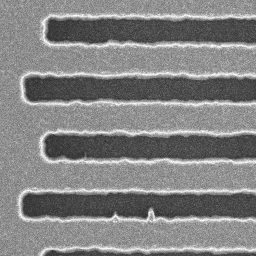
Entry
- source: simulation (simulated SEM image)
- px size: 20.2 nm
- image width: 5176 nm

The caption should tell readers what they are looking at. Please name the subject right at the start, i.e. parallel lines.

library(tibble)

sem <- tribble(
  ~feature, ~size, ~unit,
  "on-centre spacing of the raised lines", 1.18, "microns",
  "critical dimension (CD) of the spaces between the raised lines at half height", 25.9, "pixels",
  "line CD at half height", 655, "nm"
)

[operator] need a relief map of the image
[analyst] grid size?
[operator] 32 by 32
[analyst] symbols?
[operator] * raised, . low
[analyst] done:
********************************
********************************
******..........................
******..........................
******..........................
***********..*****..*******.***.
********************************
********************************
********************************
****.*.**..****...*....*****.***
***.............................
***.............................
***.............................
********************************
********************************
********************************
********************************
*****...........................
*****...........................
******..........................
********************************
********************************
********************************
********************************
***.............................
***.............................
***.............................
********************************
********************************
********************************
********************************
******.........*..*.............